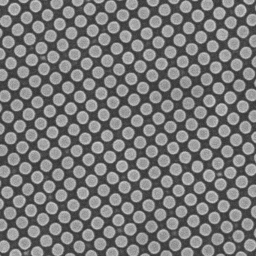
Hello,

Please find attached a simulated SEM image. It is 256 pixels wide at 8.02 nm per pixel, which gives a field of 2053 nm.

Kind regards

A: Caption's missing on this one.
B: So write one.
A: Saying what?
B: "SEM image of a regular array of raised bodies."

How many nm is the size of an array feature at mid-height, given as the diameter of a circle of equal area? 92.3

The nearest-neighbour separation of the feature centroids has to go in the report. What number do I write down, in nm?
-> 118